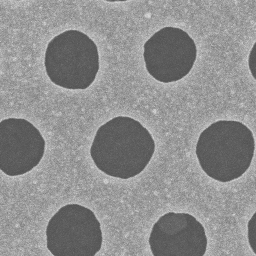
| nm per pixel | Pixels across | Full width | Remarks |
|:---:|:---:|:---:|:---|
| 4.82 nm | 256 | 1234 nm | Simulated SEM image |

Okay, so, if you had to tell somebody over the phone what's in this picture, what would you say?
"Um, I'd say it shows holes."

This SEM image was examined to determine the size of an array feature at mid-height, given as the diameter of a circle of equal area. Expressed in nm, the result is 284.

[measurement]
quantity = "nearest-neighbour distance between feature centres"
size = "480 nanometers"